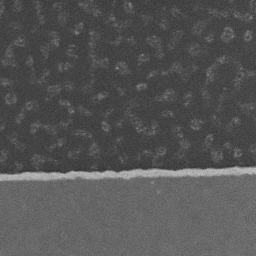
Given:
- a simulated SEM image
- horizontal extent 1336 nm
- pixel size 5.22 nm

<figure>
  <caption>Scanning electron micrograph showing one or a few lines or trenches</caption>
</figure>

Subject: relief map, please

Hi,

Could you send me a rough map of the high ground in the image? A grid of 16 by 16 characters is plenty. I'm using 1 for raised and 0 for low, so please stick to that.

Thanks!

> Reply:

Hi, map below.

0000000000000000
0000000000000000
0000000000000000
0000000000000000
0000000000000000
0000000000000000
0000000000000000
0000000000000000
0000000000000000
0000000000000000
0000000000000000
1111111111111111
1111111111111111
1111111111111111
1111111111111111
1111111111111111